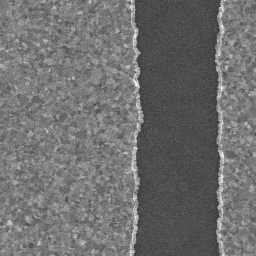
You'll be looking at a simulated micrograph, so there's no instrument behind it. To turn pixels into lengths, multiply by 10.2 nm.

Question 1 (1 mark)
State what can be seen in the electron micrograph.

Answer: one or a few lines or trenches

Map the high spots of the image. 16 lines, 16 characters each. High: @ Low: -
@@@@@@@@------@@
@@@@@@@@------@@
@@@@@@@@@-----@@
@@@@@@@@@-----@@
@@@@@@@@@-----@@
@@@@@@@@@-----@@
@@@@@@@@@-----@@
@@@@@@@@@-----@@
@@@@@@@@@-----@@
@@@@@@@@@-----@@
@@@@@@@@@-----@@
@@@@@@@@@-----@@
@@@@@@@@@-----@@
@@@@@@@@@-----@@
@@@@@@@@@-----@@
@@@@@@@@------@@